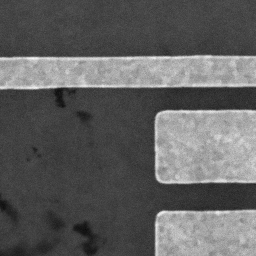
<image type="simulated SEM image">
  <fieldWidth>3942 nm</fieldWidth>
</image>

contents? wiring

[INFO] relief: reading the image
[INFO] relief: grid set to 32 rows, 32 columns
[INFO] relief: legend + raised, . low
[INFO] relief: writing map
................................
................................
................................
................................
................................
................................
................................
++++++++++++++++++++++++++++++++
++++++++++++++++++++++++++++++++
++++++++++++++++++++++++++++++++
++++++++++++++++++++++++++++++++
................................
................................
................................
....................++++++++++++
...................+++++++++++++
...................+++++++++++++
...................+++++++++++++
...................+++++++++++++
....................++++++++++++
....................++++++++++++
....................++++++++++++
....................++++++++++++
................................
................................
................................
............................++++
....................++++++++++++
....................++++++++++++
....................++++++++++++
....................++++++++++++
....................++++++++++++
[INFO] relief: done